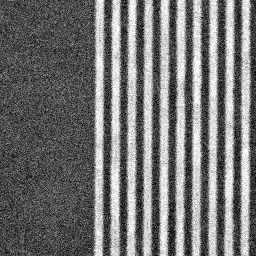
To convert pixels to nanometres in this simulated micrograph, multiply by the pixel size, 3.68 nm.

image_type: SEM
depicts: parallel lines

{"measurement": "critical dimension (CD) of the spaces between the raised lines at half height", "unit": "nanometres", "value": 39.6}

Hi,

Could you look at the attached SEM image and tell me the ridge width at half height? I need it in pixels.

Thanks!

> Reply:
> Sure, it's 4.86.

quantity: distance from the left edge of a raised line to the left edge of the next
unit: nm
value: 59.8